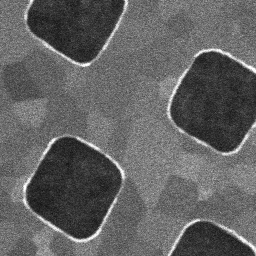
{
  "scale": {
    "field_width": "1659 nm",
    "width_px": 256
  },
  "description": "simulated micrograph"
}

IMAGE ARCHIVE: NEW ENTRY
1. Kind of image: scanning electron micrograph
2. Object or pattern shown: holes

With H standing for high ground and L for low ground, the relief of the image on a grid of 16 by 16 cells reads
HHLLLLLLHHHHHHHH
HHLLLLLHHHHHHHHH
HHHLLLLHHHHHHHHH
HHHHLLHHHHHHLLHH
HHHHHHHHHHHHLLLL
HHHHHHHHHHHLLLLL
HHHHHHHHHHHLLLLL
HHHHHHHHHHHLLLLL
HHHHHHHHHHHHLLLH
HHHLLLHHHHHHHHHH
HHLLLLLHHHHHHHHH
HHLLLLLLHHHHHHHH
HHLLLLLHHHHHHHHH
HHHLLLLHHHHHHHHH
HHHHLLHHHHHHLLHH
HHHHHHHHHHHLLLLL